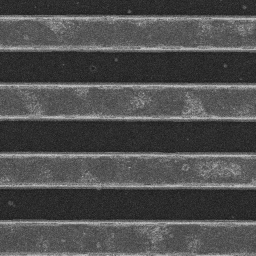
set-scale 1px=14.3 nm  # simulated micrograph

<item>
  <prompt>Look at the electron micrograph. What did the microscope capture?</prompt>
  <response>one or a few lines or trenches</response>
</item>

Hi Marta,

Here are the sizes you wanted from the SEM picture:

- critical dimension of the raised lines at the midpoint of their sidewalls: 448 nm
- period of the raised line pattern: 984 nm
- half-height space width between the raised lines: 37.1 px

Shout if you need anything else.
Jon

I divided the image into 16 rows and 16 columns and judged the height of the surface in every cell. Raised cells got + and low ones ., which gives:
................
++++++++++++++++
++++++++++++++++
................
................
++++++++++++++++
++++++++++++++++
................
................
................
++++++++++++++++
++++++++++++++++
................
................
++++++++++++++++
++++++++++++++++